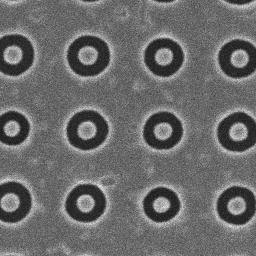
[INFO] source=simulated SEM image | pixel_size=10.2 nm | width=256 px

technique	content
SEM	ring-shaped grooves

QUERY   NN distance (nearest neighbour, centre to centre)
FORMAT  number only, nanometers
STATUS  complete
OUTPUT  750